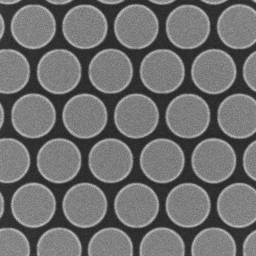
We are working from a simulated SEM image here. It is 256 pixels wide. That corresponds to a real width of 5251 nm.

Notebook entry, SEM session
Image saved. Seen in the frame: an array of small figures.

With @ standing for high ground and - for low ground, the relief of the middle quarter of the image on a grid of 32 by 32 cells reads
@@@@--@@@@@@@@@@@--@@@@@@@@@@@--
@@@@--@@@@@@@@@@@--@@@@@@@@@@@--
@@@@--@@@@@@@@@@@--@@@@@@@@@@@--
@@@@--@@@@@@@@@@@--@@@@@@@@@@@--
@@@@---@@@@@@@@@----@@@@@@@@@@--
@@@-----@@@@@@@@----@@@@@@@@@---
@@-------@@@@@--------@@@@@@----
--------------------------------
--@@@@@@-------@@@@@@-------@@@@
-@@@@@@@@@----@@@@@@@@-----@@@@@
@@@@@@@@@@---@@@@@@@@@@---@@@@@@
@@@@@@@@@@---@@@@@@@@@@---@@@@@@
@@@@@@@@@@@--@@@@@@@@@@@--@@@@@@
@@@@@@@@@@@--@@@@@@@@@@@--@@@@@@
@@@@@@@@@@---@@@@@@@@@@---@@@@@@
@@@@@@@@@@---@@@@@@@@@@---@@@@@@
-@@@@@@@@@----@@@@@@@@-----@@@@@
--@@@@@@-------@@@@@@-------@@@@
----@@-----------@@-----------@@
@@-------@@@@@@-------@@@@@-----
@@@-----@@@@@@@@----@@@@@@@@@---
@@@@---@@@@@@@@@@---@@@@@@@@@---
@@@@--@@@@@@@@@@@--@@@@@@@@@@@--
@@@@--@@@@@@@@@@@--@@@@@@@@@@@--
@@@@--@@@@@@@@@@@--@@@@@@@@@@@--
@@@@--@@@@@@@@@@@--@@@@@@@@@@@--
@@@@---@@@@@@@@@@---@@@@@@@@@---
@@@----@@@@@@@@@----@@@@@@@@@---
@@------@@@@@@@------@@@@@@@----
-----------@@----------@@@------
---@@@@@--------@@@@---------@@@
-@@@@@@@@-----@@@@@@@@-----@@@@@